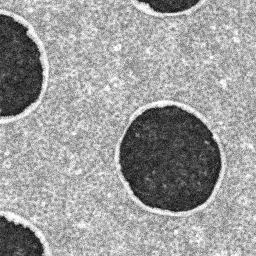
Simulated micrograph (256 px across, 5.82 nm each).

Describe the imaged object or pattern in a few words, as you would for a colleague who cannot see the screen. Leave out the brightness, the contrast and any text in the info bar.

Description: holes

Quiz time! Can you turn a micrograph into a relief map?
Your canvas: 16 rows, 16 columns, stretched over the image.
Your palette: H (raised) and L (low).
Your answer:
HHHHHHHHHLLLHHHH
LHHHHHHHHHHHHHHH
LLHHHHHHHHHHHHHH
LLLHHHHHHHHHHHHH
LLLHHHHHHHHHHHHH
LLLHHHHHHHHHHHHH
LLHHHHHHHHHHHHHH
HHHHHHHHLLLLLHHH
HHHHHHHHLLLLLHHH
HHHHHHHLLLLLLLHH
HHHHHHHHLLLLLLHH
HHHHHHHHLLLLLLHH
HHHHHHHHHLLLLHHH
HHHHHHHHHHHHHHHH
LLHHHHHHHHHHHHHH
LLLHHHHHHHHHHHHH